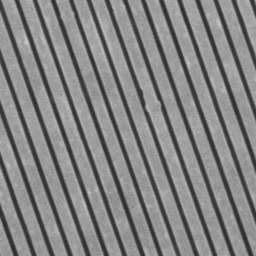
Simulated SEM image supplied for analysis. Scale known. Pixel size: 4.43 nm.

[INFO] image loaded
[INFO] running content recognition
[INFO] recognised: parallel lines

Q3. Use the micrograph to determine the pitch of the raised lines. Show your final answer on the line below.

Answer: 0.0756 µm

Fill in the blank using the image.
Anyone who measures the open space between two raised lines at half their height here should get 23.5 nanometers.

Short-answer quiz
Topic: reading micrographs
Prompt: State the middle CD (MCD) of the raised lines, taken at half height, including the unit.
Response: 50.7 nanometers